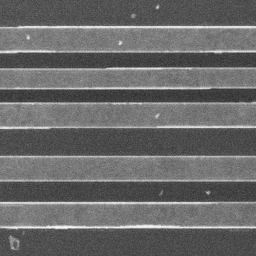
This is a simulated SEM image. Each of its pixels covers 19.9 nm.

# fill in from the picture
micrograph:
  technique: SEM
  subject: lines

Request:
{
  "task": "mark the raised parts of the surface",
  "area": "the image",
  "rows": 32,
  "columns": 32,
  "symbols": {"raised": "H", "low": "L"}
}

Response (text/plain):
LLLLLLLLLLLLLLLLLLLLLLLLLLLLLLLL
LLLLLLLLLLLLLLLLLLLLLLLLLLLLLLLL
LLLLLLLLLLLLLLLLLLLLLLLLLLLLLLLL
HHHHHHHHHHHHHHHHHHHHHHHHHHHHHHHH
HHHHHHHHHHHHHHHHHHHHHHHHHHHHHHHH
HHHHHHHHHHHHHHHHHHHHHHHHHHHHHHHH
LLLLLLLLLLLLLLLLLLLLLLLLLLLLLLLL
LLLLLLLLLLLLLLLLLLLLLLLLLLLLLLLL
LLLLLLLLLLLLLLLLLLLLLLLLLLLLLLLL
HHHHHHHHHHHHHHHHHHHHHHHHHHHHHHHH
HHHHHHHHHHHHHHHHHHHHHHHHHHHHHHHH
LLLLLLLLLLLLLLLLLLLLLLLLLLLLLLLL
LLLLLLLLLLLLLLLLLLLLLLLLLLLLLLLL
HHHHHHHHHHHHHHHHHHHHHHHHHHHHHHHH
HHHHHHHHHHHHHHHHHHHHHHHHHHHHHHHH
HHHHHHHHHHHHHHHHHHHHHHHHHHHHHHHH
LLLLLLLLLLLLLLLLLLLLLLLLLLLLLLLL
LLLLLLLLLLLLLLLLLLLLLLLLLLLLLLLL
LLLLLLLLLLLLLLLLLLLLLLLLLLLLLLLL
LLLLLLLLLLLLLLLLLLLLLLLLLLLLLLLL
HHHHHHHHHHHHHHHHHHHHHHHHHHHHHHHH
HHHHHHHHHHHHHHHHHHHHHHHHHHHHHHHH
HHHHHHHHHHHHHHHHHHHHHHHHHHHHHHHH
LLLLLLLLLLLLLLLLLLLLLLLLLLLLLLLL
LLLLLLLLLLLLLLLLLLLLLLLLLLLLLLLL
HHHHHHHHHHHHHHHHHHHHHHHHHHHHHHHH
HHHHHHHHHHHHHHHHHHHHHHHHHHHHHHHH
HHHHHHHHHHHHHHHHHHHHHHHHHHHHHHHH
LLLLLLLLLLLLLLLLLLLLLLLLLLLLLLLL
LLLLLLLLLLLLLLLLLLLLLLLLLLLLLLLL
LLLLLLLLLLLLLLLLLLLLLLLLLLLLLLLL
LLLLLLLLLLLLLLLLLLLLLLLLLLLLLLLL